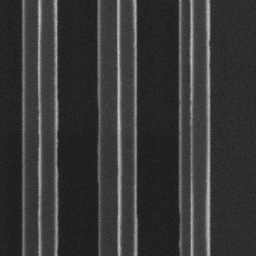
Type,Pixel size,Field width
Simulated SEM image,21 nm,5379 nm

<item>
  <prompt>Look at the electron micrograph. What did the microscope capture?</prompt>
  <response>lines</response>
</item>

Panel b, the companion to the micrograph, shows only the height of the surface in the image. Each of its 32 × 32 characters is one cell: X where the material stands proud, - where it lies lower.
---XXXX-----XXXXX-----XXXX------
---XXXX-----XXXXX-----XXXX------
---XXXX-----XXXXX-----XXXX------
---XXXX-----XXXXX------XXX------
---XXXX-----XXXXX------XXX------
---XXXX-----XXXXX------XXX------
---XXXX-----XXXXX------XXX------
---XXXX-----XXXXX------XXX------
---XXXX-----XXXXX------XXX------
---XXXX-----XXXXX------XXX------
---XXXX-----XXXXX------XXX------
---XXXX-----XXXXX------XXX------
---XXXX-----XXXXX------XXX------
---XXXX-----XXXXX------XXX------
---XXXX-----XXXXX------XXX------
---XXXX-----XXXXX------XXX------
---XXXX-----XXXXX------XXX------
---XXXX-----XXXXX------XXX------
---XXXX-----XXXXX------XXX------
---XXXX-----XXXXX------XXX------
---XXXX-----XXXXX------XXX------
---XXXX-----XXXXX------XXX------
---XXXX-----XXXXX------XXX------
---XXXX-----XXXXX------XXX------
---XXXX-----XXXXX------XXX------
---XXXX-----XXXXX------XXX------
---XXXX-----XXXXX------XXX------
---XXXX-----XXXXX------XXX------
---XXXX-----XXXXX------XXX------
---XXXX-----XXXXX------XXX------
---XXXX-----XXXXX------XXX------
---XXXX-----XXXXX------XXX------